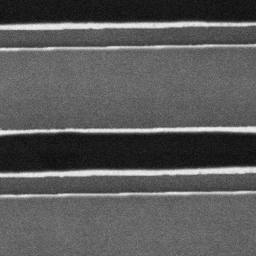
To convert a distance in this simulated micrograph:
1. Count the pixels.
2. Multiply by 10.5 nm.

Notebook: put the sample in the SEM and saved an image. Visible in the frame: lines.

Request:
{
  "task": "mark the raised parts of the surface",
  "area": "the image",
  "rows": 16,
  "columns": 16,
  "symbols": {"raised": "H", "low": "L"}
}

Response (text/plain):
HHHHHHHHHHHHHHHH
HHHHHHHHHHHHHHHH
LLLLLLLLLLLLLLLL
LLLLLLLLLLLLLLLL
LLLLLLLLLLLLLLLL
LLLLLLLLLLLLLLLL
LLLLLLLLLLLLLLLL
LLLLLLLLLLLLLLLL
HHHHHHHHHHHHHHHH
HHHHHHHHHHHHHHHH
HHHHHHHHHHHHHHHH
LLLLLLLLLLLLLLLL
LLLLLLLLLLLLLLLL
LLLLLLLLLLLLLLLL
LLLLLLLLLLLLLLLL
LLLLLLLLLLLLLLLL